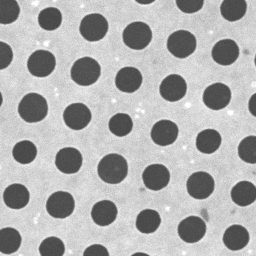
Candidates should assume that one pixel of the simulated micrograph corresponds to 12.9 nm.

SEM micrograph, a regular array of holes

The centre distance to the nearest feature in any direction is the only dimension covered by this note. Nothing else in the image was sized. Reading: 0.576 microns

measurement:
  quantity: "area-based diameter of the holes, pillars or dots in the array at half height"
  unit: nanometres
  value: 356